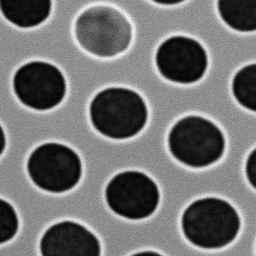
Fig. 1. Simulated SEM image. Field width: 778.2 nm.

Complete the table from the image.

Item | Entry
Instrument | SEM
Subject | holes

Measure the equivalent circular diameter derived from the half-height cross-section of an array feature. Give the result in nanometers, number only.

158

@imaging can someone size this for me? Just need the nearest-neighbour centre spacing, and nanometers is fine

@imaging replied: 251